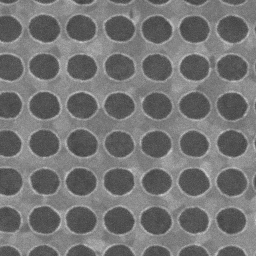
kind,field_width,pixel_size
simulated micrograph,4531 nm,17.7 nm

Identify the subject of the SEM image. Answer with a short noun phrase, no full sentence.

a regular array of holes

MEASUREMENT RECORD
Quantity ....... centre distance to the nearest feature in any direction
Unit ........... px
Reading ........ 37.2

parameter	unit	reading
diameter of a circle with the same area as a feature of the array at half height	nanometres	524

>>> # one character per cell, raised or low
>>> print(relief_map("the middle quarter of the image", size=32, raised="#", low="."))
#.......##........#........##...
#.......##........##.......##...
#.......###.......##.......##...
##.....#####....#####.....####..
################################
################################
################################
##.....#####....#####....######.
#.......###......###......###...
#.......##........##.......##...
#........#........#........##...
#.......##........##.......##...
##......###......###......####..
###...######....######...######.
################################
################################
###...##########################
#......####.....####......####..
#.......##.......###.......##...
.........#.......##........##...
#........#........#........##...
#.......###......##........##...
##......###......###......####..
##############.#######..########
################################
################################
##....#####.....######...#####..
#.......##.......###......###...
........##........#........##...
........##........#........#....
#.......##........##.......##...
#.......###......###......###...